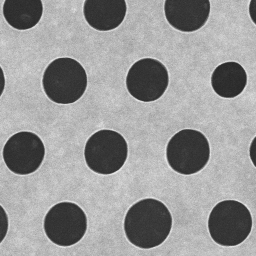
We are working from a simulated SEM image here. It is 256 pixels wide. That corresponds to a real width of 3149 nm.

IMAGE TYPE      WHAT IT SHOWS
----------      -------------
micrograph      a regular array of holes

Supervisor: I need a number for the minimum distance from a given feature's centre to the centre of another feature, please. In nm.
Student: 1010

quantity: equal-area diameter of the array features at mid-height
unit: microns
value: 0.539